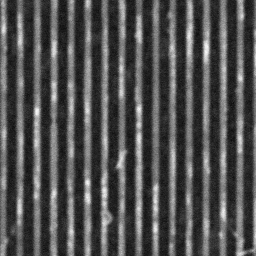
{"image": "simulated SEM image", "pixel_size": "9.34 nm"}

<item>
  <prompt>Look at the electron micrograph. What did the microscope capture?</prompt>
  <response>parallel lines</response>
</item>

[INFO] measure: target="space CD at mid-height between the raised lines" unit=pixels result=11.9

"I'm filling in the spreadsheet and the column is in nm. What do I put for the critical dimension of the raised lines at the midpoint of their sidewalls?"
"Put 47.9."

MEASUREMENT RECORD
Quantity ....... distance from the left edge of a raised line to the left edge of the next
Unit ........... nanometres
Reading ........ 158